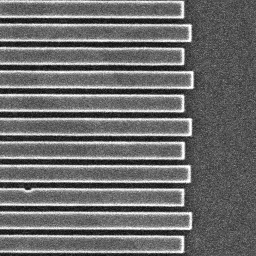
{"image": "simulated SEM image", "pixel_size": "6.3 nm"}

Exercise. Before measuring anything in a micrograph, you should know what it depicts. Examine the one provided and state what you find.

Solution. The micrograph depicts parallel lines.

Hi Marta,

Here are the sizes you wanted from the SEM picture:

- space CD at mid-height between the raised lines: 45.7 nm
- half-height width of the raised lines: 103 nm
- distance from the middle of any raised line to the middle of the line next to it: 148 nm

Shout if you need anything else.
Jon